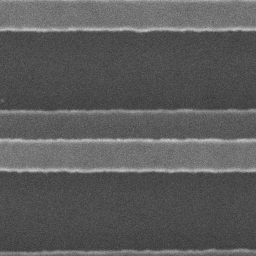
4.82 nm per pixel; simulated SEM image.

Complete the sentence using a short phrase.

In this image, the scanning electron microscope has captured lines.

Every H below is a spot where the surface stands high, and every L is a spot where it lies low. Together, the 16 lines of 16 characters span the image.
HHHHHHHHHHHHHHHH
HHHHHHHHHHHHHHHH
LLLLLLLLLLLLLLLL
LLLLLLLLLLLLLLLL
LLLLLLLLLLLLLLLL
LLLLLLLLLLLLLLLL
LLLLLLLLLLLLLLLL
LLLLLLLLLLLLLLLL
LLLLLLLLLLLLLLLL
HHHHHHHHHHHHHHHH
HHHHHHHHHHHHHHHH
LLLLLLLLLLLLLLLL
LLLLLLLLLLLLLLLL
LLLLLLLLLLLLLLLL
LLLLLLLLLLLLLLLL
LLLLLLLLLLLLLLLL